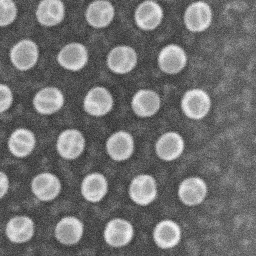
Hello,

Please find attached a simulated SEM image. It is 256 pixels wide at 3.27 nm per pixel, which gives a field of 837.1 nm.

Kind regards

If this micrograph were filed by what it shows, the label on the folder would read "a regular array of raised bodies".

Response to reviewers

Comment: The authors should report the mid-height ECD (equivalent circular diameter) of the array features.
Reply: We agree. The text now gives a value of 26.7 px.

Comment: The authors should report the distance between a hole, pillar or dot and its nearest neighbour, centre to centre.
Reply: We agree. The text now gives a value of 0.159 um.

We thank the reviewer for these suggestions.